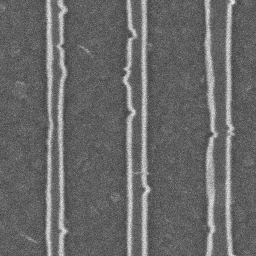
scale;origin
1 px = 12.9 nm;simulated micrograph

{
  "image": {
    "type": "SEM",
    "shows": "one or a few lines or trenches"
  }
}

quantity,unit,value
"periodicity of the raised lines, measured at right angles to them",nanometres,1060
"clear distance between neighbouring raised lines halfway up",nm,876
